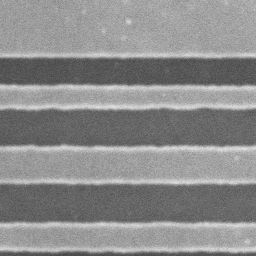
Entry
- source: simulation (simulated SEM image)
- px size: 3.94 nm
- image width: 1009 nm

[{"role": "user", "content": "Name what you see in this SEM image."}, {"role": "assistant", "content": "lines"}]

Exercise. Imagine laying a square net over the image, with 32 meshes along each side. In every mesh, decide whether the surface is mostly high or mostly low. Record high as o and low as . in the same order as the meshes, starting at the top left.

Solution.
oooooooooooooooooooooooooooooooo
oooooooooooooooooooooooooooooooo
oooooooooooooooooooooooooooooooo
oooooooooooooooooooooooooooooooo
oooooooooooooooooooooooooooooooo
oooooooooooooooooooooooooooooooo
oooooooooooooooooooooooooooooooo
................................
................................
................................
................................
oooooooooooooooooooooooooooooooo
oooooooooooooooooooooooooooooooo
o.oooo.oo...ooo.oo...ooo.....oo.
................................
................................
................................
................................
ooooo.oooo..oo...oo.ooooooo.oooo
oooooooooooooooooooooooooooooooo
oooooooooooooooooooooooooooooooo
oooooooooooooooooooooooooooooooo
oooooooooooooooooooooooooooooooo
................................
................................
................................
................................
................................
oooooooooooooooooooooooooooooooo
oooooooooooooooooooooooooooooooo
oooooooooooooooooooooooooooooooo
................................